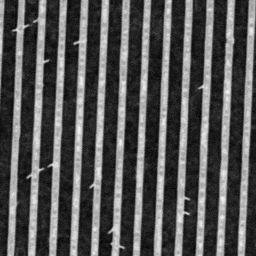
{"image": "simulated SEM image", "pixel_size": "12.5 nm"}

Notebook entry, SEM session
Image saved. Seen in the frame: parallel lines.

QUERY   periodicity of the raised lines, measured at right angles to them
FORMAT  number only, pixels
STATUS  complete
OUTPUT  20.9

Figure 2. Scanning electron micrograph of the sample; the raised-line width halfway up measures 86 nm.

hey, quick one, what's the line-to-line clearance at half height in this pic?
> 181 nanometers